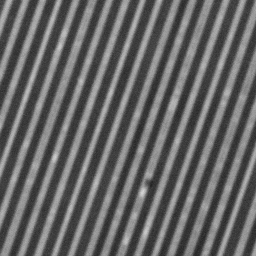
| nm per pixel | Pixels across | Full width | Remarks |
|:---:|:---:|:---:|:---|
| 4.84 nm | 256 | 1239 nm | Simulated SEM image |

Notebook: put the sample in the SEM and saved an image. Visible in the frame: parallel lines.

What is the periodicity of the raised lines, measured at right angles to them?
76.2 nm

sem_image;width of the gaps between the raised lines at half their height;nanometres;46.9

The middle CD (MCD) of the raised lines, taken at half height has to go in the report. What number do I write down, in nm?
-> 29.7